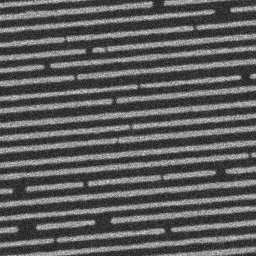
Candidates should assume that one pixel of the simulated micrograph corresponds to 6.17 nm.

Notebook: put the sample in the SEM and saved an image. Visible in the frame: parallel lines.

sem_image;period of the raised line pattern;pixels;13.3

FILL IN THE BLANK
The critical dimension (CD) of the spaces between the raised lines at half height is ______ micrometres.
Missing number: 0.0561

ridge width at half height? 30.7 nm